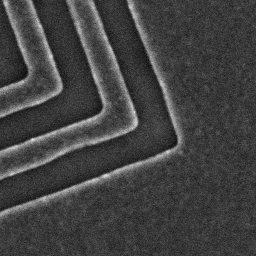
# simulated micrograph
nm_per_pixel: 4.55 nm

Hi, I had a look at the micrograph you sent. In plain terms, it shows groups of lines, slits or small figures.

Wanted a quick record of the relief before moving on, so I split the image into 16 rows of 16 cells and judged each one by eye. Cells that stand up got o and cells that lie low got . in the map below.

oo..oo..oooooooo
.oo..o..oooooooo
.oo..oo..ooooooo
.oo..oo..ooooooo
..oo..oo..oooooo
oooo..oo..oooooo
oo....oo..oooooo
.....oooo..ooooo
...oooo....ooooo
oooo......oooooo
oo......oooooooo
.....ooooooooooo
..oooooooooooooo
oooooooooooooooo
oooooooooooooooo
oooooooooooooooo